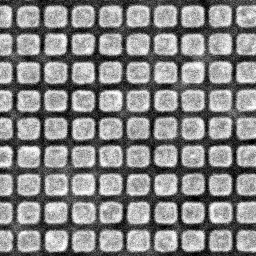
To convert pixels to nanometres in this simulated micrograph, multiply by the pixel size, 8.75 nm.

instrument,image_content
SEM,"a regular array of raised bodies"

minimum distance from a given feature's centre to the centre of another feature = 238 nm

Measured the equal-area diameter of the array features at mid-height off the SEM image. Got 194 nm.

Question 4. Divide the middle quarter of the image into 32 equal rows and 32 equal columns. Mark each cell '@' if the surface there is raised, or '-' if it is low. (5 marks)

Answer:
--@@@@@--@@@@@--@@@@@--@@@@@--@@
--@@@@@--@@@@@--@@@@@--@@@@@--@@
--@@@@@--@@@@@--@@@@@--@@@@@--@@
--@@@@@--@@@@@--@@@@@--@@@@@--@@
---@@@@---@@@----@@@---@@@@---@@
--------------------------------
--------------------------------
--@@@@@---@@@@--@@@@@--@@@@@--@@
--@@@@@--@@@@@--@@@@@--@@@@@--@@
--@@@@@--@@@@@--@@@@@--@@@@@--@@
--@@@@@--@@@@@--@@@@@--@@@@@--@@
---@@@@---@@@----@@@----@@@----@
--------------------------------
--------------------------------
---@@@@--@@@@@--@@@@@--@@@@@--@@
--@@@@@--@@@@@--@@@@@--@@@@@--@@
--@@@@@--@@@@@--@@@@@--@@@@@--@@
--@@@@@--@@@@@--@@@@@--@@@@@--@@
---@@--------------------------@
--------------------------------
--------------------------------
--@@@@@--@@@@@--@@@@@--@@@@@--@@
--@@@@@--@@@@@--@@@@@--@@@@@--@@
--@@@@@--@@@@@--@@@@@--@@@@@--@@
--@@@@@--@@@@@--@@@@@--@@@@@--@@
---@@@@---@@--------------------
--------------------------------
--------------------------------
---@@@@--@@@@@--@@@@@--@@@@@--@@
--@@@@@--@@@@@--@@@@@--@@@@@--@@
--@@@@@@-@@@@@--@@@@@--@@@@@--@@
@-@@@@@--@@@@@--@@@@@--@@@@@--@@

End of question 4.